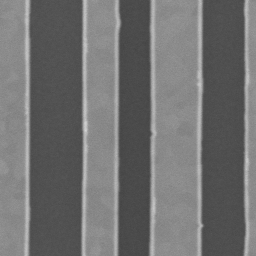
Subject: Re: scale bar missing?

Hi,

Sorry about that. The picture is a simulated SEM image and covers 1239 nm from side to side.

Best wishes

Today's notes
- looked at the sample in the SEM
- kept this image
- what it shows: one or a few lines or trenches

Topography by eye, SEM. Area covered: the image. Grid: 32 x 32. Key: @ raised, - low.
@@@--------@@@@----@@@@@@------@
@@@--------@@@@----@@@@@@------@
@@@--------@@@@----@@@@@@------@
@@@--------@@@@----@@@@@@------@
@@@--------@@@@----@@@@@@------@
@@@--------@@@@----@@@@@@------@
@@@--------@@@@----@@@@@@------@
@@@--------@@@@----@@@@@@------@
@@@--------@@@@----@@@@@@------@
@@@--------@@@@----@@@@@@------@
@@@--------@@@@----@@@@@@------@
@@@--------@@@@----@@@@@@------@
@@@--------@@@@----@@@@@@------@
@@@--------@@@@----@@@@@@------@
@@@--------@@@@----@@@@@@------@
@@@--------@@@@----@@@@@@------@
@@@--------@@@@----@@@@@@------@
@@@--------@@@@----@@@@@@------@
@@@--------@@@@----@@@@@@------@
@@@--------@@@@----@@@@@@------@
@@@--------@@@@----@@@@@@------@
@@@--------@@@@----@@@@@@------@
@@@--------@@@@----@@@@@@------@
@@@--------@@@@----@@@@@@------@
@@@-------@@@@@----@@@@@@------@
@@@-------@@@@@----@@@@@@------@
@@@--------@@@@----@@@@@@------@
@@@-------@@@@@----@@@@@@------@
@@@-------@@@@@----@@@@@@------@
@@@-------@@@@@----@@@@@@------@
@@@-------@@@@-----@@@@@@------@
@@@-------@@@@-----@@@@@@------@